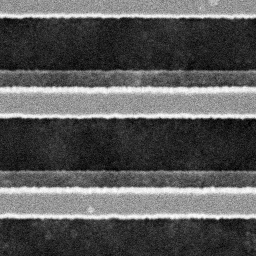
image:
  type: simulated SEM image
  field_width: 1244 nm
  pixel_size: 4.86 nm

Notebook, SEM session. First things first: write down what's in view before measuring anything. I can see lines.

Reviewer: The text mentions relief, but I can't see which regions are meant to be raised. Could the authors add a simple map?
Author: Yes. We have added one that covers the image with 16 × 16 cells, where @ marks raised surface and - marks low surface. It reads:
@@@@@@@@@@@@@@@@
----------------
----------------
----------------
@@@@@@@@@@@@@@@@
@@@@@@@@@@@@@@@@
@@@@@@@@@@@@@@@@
----------------
----------------
----------------
----------------
@@@@@@@@@@@@@@@@
@@@@@@@@@@@@@@@@
@@@@@@@@@@@@@@@@
----------------
----------------